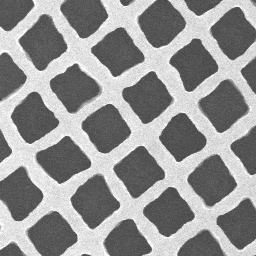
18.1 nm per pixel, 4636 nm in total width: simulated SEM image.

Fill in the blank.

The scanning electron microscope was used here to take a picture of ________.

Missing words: a regular array of holes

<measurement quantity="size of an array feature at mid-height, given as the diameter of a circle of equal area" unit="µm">0.809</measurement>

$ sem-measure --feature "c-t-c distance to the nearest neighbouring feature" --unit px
51.4